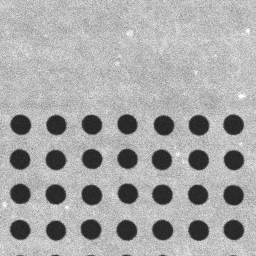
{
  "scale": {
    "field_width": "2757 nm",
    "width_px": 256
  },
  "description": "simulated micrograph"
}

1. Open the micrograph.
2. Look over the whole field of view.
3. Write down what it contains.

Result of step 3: a regular array of holes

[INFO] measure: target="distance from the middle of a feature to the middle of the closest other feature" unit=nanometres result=373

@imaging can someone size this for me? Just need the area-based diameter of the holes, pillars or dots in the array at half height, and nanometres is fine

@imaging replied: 224